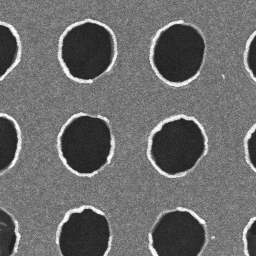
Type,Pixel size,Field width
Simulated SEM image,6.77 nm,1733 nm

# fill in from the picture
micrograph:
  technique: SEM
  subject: holes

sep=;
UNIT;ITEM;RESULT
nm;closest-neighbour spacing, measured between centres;618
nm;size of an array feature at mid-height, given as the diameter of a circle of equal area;366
